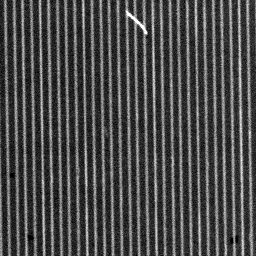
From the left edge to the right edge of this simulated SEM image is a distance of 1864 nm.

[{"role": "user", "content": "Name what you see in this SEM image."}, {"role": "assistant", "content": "parallel lines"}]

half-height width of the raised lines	14.6	nm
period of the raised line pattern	0.063	um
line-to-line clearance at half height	50	nanometers